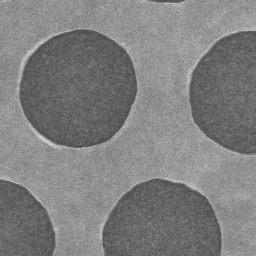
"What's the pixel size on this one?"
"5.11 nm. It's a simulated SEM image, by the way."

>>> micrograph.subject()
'holes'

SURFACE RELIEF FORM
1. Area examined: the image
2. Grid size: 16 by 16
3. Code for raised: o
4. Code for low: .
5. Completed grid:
oooooooooooooooo
oooooooooooooooo
ooo....ooooooo..
oo......ooooo...
o.......oooo....
o........ooo....
o.......oooo....
oo......oooo....
ooo....oooooo...
ooooooooooooooo.
oooooooooooooooo
.oooooooo..ooooo
..ooooo......ooo
...oooo......ooo
...ooo........oo
...ooo........oo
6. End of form